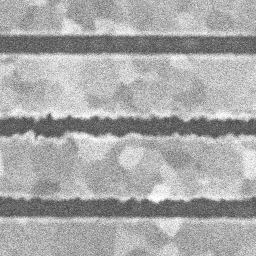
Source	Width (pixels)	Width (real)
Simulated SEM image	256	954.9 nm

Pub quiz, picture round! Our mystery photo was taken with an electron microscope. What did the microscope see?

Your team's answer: one or a few lines or trenches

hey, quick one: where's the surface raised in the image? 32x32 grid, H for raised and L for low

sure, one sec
HHHHHHHHHHHHHHHHHHHHHHHHHHHHHHHH
HHHHHHHHHHHHHHHHHHHHHHHHHHHHHHHH
HHHHHHHHHHHHHHHHHHHHHHHHHHHHHHHH
HHHHHHHHHHHHHHHHHHHHHHHHHHHHHHHH
LLLLLLLLLLLLLLLLLLLLLLLLLLLLLLLL
LLLLLLLLLLLLLLLLLLLLLLLLLLLLLLLL
LLLLLLLLLLLLLLLLLLLLLLLLLLLLLLLL
HHHHHHHHHHHHHHHHHHHHHHHHHHHHHHHH
HHHHHHHHHHHHHHHHHHHHHHHHHHHHHHHH
HHHHHHHHHHHHHHHHHHHHHHHHHHHHHHHH
HHHHHHHHHHHHHHHHHHHHHHHHHHHHHHHH
HHHHHHHHHHHHHHHHHHHHHHHHHHHHHHHH
HHHHHHHHHHHHHHHHHHHHHHHHHHHHHHHH
HHHHHHHHHHHHHHHHHHHHHHHHHHHHHHHH
LLLLHLLHLHHHHHHLHHHLHLHHHLHHHHHH
LLLLLLLLLLLLLLLLLLLLLLLLLLLLLLLL
LLLLLLLLLLLLLLLLLLLLLLLLLLLLLLLL
HHHHHHHHHHHHHHHHHHHHHHHHHHHHHHHH
HHHHHHHHHHHHHHHHHHHHHHHHHHHHHHHH
HHHHHHHHHHHHHHHHHHHHHHHHHHHHHHHH
HHHHHHHHHHHHHHHHHHHHHHHHHHHHHHHH
HHHHHHHHHHHHHHHHHHHHHHHHHHHHHHHH
HHHHHHHHHHHHHHHHHHHHHHHHHHHHHHHH
HHHHHHHHHHHHHHHHHHHHHHHHHHHHHHHH
LHHHHHHHHHHHHHHHHHHHHHHHHHHHHHHH
LLLLLLLLLLLLLLLLLLLLLLLLLLLLLLLL
LLLLLLLLLLLLLLLLLLLLLLLLLLLLLLLL
HHHHHHHHHHHHHHHHHHHHHHHHLLHHHHLH
HHHHHHHHHHHHHHHHHHHHHHHHHHHHHHHH
HHHHHHHHHHHHHHHHHHHHHHHHHHHHHHHH
HHHHHHHHHHHHHHHHHHHHHHHHHHHHHHHH
HHHHHHHHHHHHHHHHHHHHHHHHHHHHHHHH